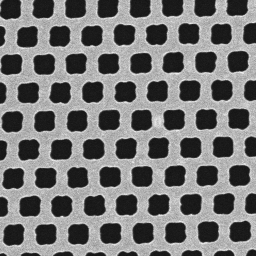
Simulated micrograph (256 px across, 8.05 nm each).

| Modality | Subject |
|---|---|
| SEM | a regular array of holes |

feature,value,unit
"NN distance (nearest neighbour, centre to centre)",258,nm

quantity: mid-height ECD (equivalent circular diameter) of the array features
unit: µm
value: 0.18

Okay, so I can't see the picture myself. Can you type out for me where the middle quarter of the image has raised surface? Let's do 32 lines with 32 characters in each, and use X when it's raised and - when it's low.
------XXX-----XXX-----XXX-----XX
-----XXXX-----XXX-----XXX-----XX
XXXXXXXXXX---XXXXXXXXXXXXXXXXXXX
XXXXXXXXXXXXXXXXXXXXXXXXXXXXXXXX
-XXXXX---XXXXXX--XXXXX----XXXX--
--XXX-----XXX-----XXX-----XXX---
--XX------XXX-----XXX-----XXX---
--XXX-----XXX-----XXX-----XXX---
--XXX-----XXX-----XXX-----XXX---
-XXXX----XXXX--X-XXXXXXXXXXXXXXX
XXXXXXXXXXXXXXXXXXXXXXXXXXXXXXXX
XXXX-XXXXX-X-XXXXXXX-XXXXX---XXX
X-----XXX-----XXX-----XXX-----XX
X-----XXX-----XXX-----XXX-----XX
X-----XXX-----XXX-----XXX-----XX
X-----XXX-----XXX-----XXX-----XX
X----XXXX---XXXXXX---XXXXX---XXX
XXXXXXXXXXXXXXXXXXXXXXXXXXXXXXXX
XXXXXXXXXXXXXXXXXXXXXX----XXXX--
--XXX-----XXX-----XXX-----XXX---
--XXX-----XXX-----XXX-----XXX---
--XXX-----XXX-----XXX-----XXX---
--XXX-----XXX-----XXX-----XXX---
-XXXX----XXXXX---XXXX----XXXXXX-
XXXXXXXXXXXXXXXXXXXXXXXXXXXXXXXX
XXXXXXXXXXXXXXXXXX-X-XXXXXXX-XXX
X-----XXX-----XXX-----XXX------X
X-----XXX-----XXX-----XXX-----XX
X-----XXX-----XXX-----XXX-----XX
X-----XXX-----XXX-----XXX-----XX
X----XXXX----XXXXX----XXXX---XXX
XXXXXXXXXXXXXXXXXXXXXXXXXXXXXXXX